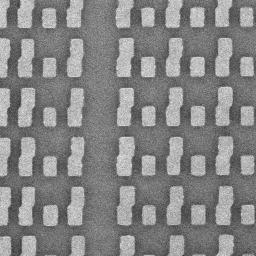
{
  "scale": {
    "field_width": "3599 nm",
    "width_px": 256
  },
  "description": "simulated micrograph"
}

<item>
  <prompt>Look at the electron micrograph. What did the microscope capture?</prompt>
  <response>wiring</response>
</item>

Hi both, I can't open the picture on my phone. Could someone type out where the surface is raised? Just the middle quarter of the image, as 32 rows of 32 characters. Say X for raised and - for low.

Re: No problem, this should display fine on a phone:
-XXX---------XXXX--XXXX---XXX---
-XXX---------XXXX--XXXX---XXX---
-XXX---------XXXX--XXXX---XXX---
--------------------------------
--------------------------------
--------------------------------
--XXX---------XXX----------XX---
--XXX---------XXX----------XX---
--XXX---------XXX----------XX---
--XXX---------XXX----------XX---
--XXX---------XXX---------XXX---
-XXX----------XXX---XXX---XXX---
-XXX----------XXX---XXX---XXX---
-XXX----------XXX---XXX---XXX---
-XXX----------XXX---XXX---XXX---
--------------------------------
--------------------------------
--------------------------------
--XX----------XXX----------XX---
--XXX---------XXX----------XX---
--XXX---------XXX----------XX---
--XXX---------XXX----------XX---
--XXX---------XXX----------XX---
-XXX---------XXXX---XXX---XXX---
-XXX---------XXXX---XXX---XXX---
-XXX---------XXXX---XXX---XXX---
-XXX---------XXXX---XXX---XXX---
-XXX----------XXX---XX----XXX---
--------------------------------
--------------------------------
--------------------------------
--XXX---------XXX----------XXX--